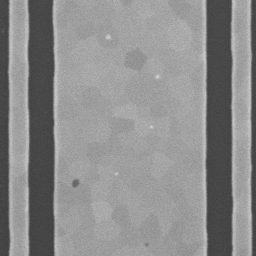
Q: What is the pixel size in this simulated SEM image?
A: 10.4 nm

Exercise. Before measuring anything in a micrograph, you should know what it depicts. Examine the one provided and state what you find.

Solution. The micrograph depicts wiring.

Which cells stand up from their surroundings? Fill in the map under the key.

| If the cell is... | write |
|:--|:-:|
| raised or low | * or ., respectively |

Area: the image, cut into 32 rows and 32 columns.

.**....*******************...**.
.***...*******************...**.
.***...*******************...**.
.***...*******************...**.
.***...*******************...**.
.**....*******************...**.
.**....*******************...**.
.**....*******************...**.
.***...*******************...**.
.***...*******************...**.
.**....*******************...**.
.**....*******************...**.
.**....*******************...**.
.***...*******************...**.
.***...*******************...**.
.***...*******************...**.
.***...*******************...**.
.***...*******************...**.
.***...*******************...**.
.***...*******************...**.
.***...*******************...**.
.**....*******************...**.
.**....*******************...**.
.***...*******************...**.
.***...*******************...**.
.***...*******************...**.
.***...*******************...**.
.***...*******************...**.
.***...*******************...**.
.***...*******************...**.
.***...*******************...**.
.***...*******************...**.